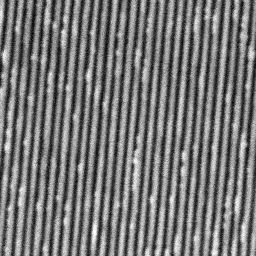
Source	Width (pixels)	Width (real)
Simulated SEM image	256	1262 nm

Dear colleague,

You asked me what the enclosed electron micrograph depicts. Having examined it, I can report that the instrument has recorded parallel lines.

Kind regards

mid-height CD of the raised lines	23.9	nanometers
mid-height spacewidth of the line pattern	23.9	nm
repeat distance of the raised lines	46.2	nanometres